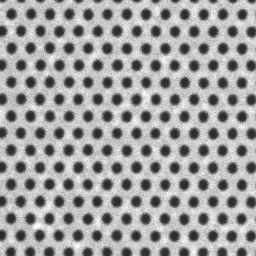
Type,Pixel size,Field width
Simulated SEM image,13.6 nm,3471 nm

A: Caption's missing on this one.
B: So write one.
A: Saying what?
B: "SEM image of a regular array of holes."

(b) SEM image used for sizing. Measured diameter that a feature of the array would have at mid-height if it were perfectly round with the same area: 160 nm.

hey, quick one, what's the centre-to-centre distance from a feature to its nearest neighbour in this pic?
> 19 pixels